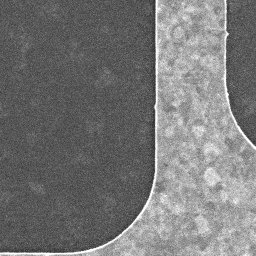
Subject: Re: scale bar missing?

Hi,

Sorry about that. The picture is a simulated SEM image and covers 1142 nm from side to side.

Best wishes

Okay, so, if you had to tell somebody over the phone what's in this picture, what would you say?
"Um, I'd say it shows one or a few lines or trenches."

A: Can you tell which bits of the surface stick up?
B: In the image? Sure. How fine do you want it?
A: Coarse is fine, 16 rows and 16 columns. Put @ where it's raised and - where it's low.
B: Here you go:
----------@@@@--
----------@@@@--
----------@@@@--
----------@@@@--
----------@@@@--
----------@@@@--
----------@@@@--
----------@@@@@-
----------@@@@@-
----------@@@@@@
----------@@@@@@
----------@@@@@@
---------@@@@@@@
---------@@@@@@@
--------@@@@@@@@
------@@@@@@@@@@